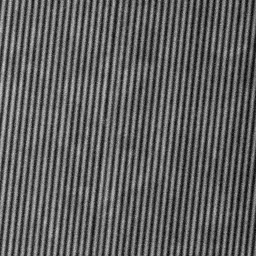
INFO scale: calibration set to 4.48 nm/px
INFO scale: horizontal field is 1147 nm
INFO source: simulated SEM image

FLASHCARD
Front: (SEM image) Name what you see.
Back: parallel lines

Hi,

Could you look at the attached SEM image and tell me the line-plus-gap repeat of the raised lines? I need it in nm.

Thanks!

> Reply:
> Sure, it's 28.8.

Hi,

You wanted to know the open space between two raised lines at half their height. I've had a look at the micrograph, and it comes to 17.2 nm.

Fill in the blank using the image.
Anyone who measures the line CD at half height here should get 2.48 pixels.